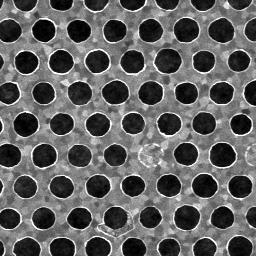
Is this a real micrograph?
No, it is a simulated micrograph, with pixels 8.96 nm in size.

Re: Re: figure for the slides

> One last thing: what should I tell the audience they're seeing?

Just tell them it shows a regular array of holes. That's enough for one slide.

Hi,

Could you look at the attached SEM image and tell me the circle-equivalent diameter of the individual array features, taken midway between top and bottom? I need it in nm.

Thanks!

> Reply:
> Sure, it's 212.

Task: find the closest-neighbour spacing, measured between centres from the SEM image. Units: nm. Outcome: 316